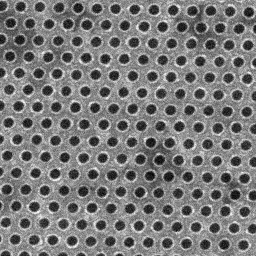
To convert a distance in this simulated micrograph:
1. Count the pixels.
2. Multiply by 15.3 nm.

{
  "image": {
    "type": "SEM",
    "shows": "a regular array of holes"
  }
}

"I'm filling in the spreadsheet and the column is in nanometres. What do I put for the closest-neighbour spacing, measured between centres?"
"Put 288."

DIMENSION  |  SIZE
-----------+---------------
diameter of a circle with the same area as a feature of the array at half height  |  11 px